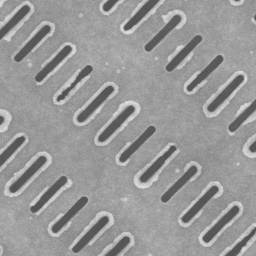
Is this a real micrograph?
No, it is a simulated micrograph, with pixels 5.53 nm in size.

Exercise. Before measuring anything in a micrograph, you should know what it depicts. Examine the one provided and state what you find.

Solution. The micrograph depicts a regular array of holes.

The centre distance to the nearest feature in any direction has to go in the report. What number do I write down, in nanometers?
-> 160